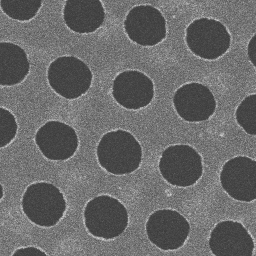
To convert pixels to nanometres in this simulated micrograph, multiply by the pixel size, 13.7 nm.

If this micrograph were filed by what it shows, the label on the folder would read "a regular array of holes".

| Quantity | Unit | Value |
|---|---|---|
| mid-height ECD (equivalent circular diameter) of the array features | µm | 0.58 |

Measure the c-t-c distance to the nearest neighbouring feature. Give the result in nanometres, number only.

863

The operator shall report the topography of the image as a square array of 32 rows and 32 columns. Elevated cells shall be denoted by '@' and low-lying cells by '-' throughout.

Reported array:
-----@@@-----@@@@@@@@@@@@@@@@@@@
@----@@@-----@@@----@@@@@@@@@@@@
@@-@@@@@-----@@@-----@@@@--@@@@@
@@@@@@@@@---@@@@-----@@-----@@@@
@@@@@@@@@@@@@@@@-----@@------@@@
--@@@@@@@@@@@@@@@--@@@@------@@-
---@@@@@@@@@@@@@@@@@@@@@----@@@-
---@@@@---@@@@@@@@@@@@@@@@@@@@@-
----@@-----@@@@@@@@@@@@@@@@@@@@@
---@@@-----@@@@---@@@@@@@@@@@@@@
--@@@@-----@@@-----@@@@--@@@@@@@
@@@@@@@----@@@-----@@@----@@@@@@
@@@@@@@@@@@@@@-----@@@-----@@@--
@@@@@@@@@@@@@@@@--@@@@-----@@@--
--@@@@@@@@@@@@@@@@@@@@@---@@@@--
--@@@@--@@@@@@@@@@@@@@@@@@@@@@--
--@@@----@@@@@--@@@@@@@@@@@@@@@-
-@@@------@@@----@@@@@@@@@@@@@@@
@@@@@-----@@------@@@---@@@@@@@@
@@@@@@---@@@------@@-----@@@@@@@
@@@@@@@@@@@@@----@@@-----@@@----
@@@@@@@@@@@@@@--@@@@-----@@@----
@@@@@@@@@@@@@@@@@@@@@----@@@----
@@@@---@@@@@@@@@@@@@@@@@@@@@----
@@@-----@@@@-@@@@@@@@@@@@@@@@---
@@@-----@@@----@@@@@@@@@@@@@@@@@
@@@-----@@@-----@@@---@@@@@@@@@@
@@@@---@@@@-----@@@----@@@@@@@@@
@@@@@@@@@@@-----@@------@@@----@
@@@@@@@@@@@@---@@@-----@@@-----@
@@@@@@@@@@@@@@@@@@@----@@@------
@@---@@@@@@@@@@@@@@@@@@@@@@-----